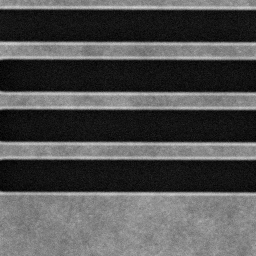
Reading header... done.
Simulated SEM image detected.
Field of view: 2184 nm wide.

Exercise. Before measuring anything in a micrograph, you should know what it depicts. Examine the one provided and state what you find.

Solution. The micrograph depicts groups of lines, slits or small figures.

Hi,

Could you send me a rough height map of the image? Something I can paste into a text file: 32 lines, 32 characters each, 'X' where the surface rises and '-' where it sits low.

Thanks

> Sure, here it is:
XXXXXXXXXXXXXXXXXXXXXXXXXXXXXXXX
--------------------------------
--------------------------------
--------------------------------
--------------------------------
XXXXXXXXXXXXXXXXXXXXXXXXXXXXXXXX
XXXXXXXXXXXXXXXXXXXXXXXXXXXXXXXX
--------------------------------
--------------------------------
--------------------------------
--------------------------------
--------------------------------
XXXXXXXXXXXXXXXXXXXXXXXXXXXXXXXX
X---------XXXXXXXXXXXXXXXXXXXXXX
--------------------------------
--------------------------------
--------------------------------
--------------------------------
XXXXXXXXXXXXXXXXXXXXXXXXXXXXXXXX
XXXXXXXXXXXXXXXXXXXXXXXXXXXXXXXX
--------------------------------
--------------------------------
--------------------------------
--------------------------------
XXXXXXXXXXXXXXXXXXXXXXXXXXXXXXXX
XXXXXXXXXXXXXXXXXXXXXXXXXXXXXXXX
XXXXXXXXXXXXXXXXXXXXXXXXXXXXXXXX
XXXXXXXXXXXXXXXXXXXXXXXXXXXXXXXX
XXXXXXXXXXXXXXXXXXXXXXXXXXXXXXXX
XXXXXXXXXXXXXXXXXXXXXXXXXXXXXXXX
XXXXXXXXXXXXXXXXXXXXXXXXXXXXXXXX
XXXXXXXXXXXXXXXXXXXXXXXXXXXXXXXX